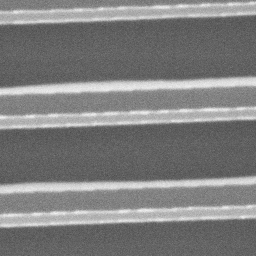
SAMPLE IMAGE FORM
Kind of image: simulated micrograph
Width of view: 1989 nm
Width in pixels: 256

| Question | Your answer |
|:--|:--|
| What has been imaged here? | lines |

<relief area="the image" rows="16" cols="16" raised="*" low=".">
****************
................
................
................
................
.........*******
****************
*************...
................
................
................
.............***
****************
****************
................
................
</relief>